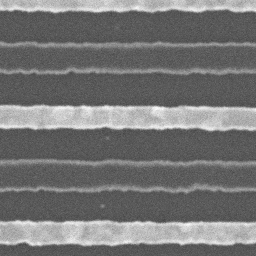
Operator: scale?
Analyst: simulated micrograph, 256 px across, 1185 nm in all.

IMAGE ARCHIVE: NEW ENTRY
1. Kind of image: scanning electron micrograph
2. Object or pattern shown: lines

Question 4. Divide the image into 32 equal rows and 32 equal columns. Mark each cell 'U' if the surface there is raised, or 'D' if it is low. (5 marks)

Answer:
UUUUUUUUUUUUUUUUUUUUUUUUUUUUUUUU
DDDDDDDDDDDDDDDDDDDDDDDDDDDDDDDD
DDDDDDDDDDDDDDDDDDDDDDDDDDDDDDDD
DDDDDDDDDDDDDDDDDDDDDDDDDDDDDDDD
DDDDDDDDDDDDDDDDDDDDDDDDDDDDDDDD
UDUUUDDDDDDDDDDDDDDUUDDDUUUUUUUU
UUUUUUUUUUUUUUUUUUUUUUUUUUUUUUUU
UUUUUUUUUUUUUUUUUUUUUUUUUUUUUUUU
UUUUUUUUUUUUUUUUUUUUUUUUUUUUUUUU
DDDDDDDDDDDDDDDDDDDDDDDDDDDDDDDD
DDDDDDDDDDDDDDDDDDDDDDDDDDDDDDDD
DDDDDDDDDDDDDDDDDDDDDDDDDDDDDDDD
DDDDDDDDDDDDDDDDDDDDDDDDDDDDDDDD
UUUUUUUUUUUUUUUUUUUUUUUUUUUUUUUD
UUUUUUUUUUUUUUUUUUUUUUUUUUUUUUUU
UUUUUUUUUUUUUUUUUUUUUUUUUUUUUUUU
DDDDDDDDDDDDDDDDDDDDDDDDDDDDDDDD
DDDDDDDDDDDDDDDDDDDDDDDDDDDDDDDD
DDDDDDDDDDDDDDDDDDDDDDDDDDDDDDDD
DDDDDDDDDDDDDDDDDDDDDDDDDDDDDDDD
UUUUUUUUUUUUUUUUUUUUUUUUUUUUUUUU
UUUUUUUUUUUUUUUUUUUUUUUUUUUUUUUU
UUUUUUUUUUUUUUUUUUUUUUUUUUUUUUUU
UUUUUUUUUUUUUUDUUUUUUUUUDDUUUUUU
DDDDDDDDDDDDDDDDDDDDDDDDDDDDDDDD
DDDDDDDDDDDDDDDDDDDDDDDDDDDDDDDD
DDDDDDDDDDDDDDDDDDDDDDDDDDDDDDDD
DDDDDDDDDDDDDDDDDDDDDDDDDDDDDDDD
UUUUUUUUUUUUUUUUUUUUUUUUUUUUUUUU
UUUUUUUUUUUUUUUUUUUUUUUUUUUUUUUU
DUDDUUDDDDUUUUUDDDDDDDDDDDDUUDDD
DDDDDDDDDDDDDDDDDDDDDDDDDDDDDDDD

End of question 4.